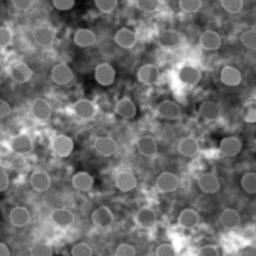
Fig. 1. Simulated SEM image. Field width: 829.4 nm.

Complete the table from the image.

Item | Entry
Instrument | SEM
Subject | a regular array of raised bodies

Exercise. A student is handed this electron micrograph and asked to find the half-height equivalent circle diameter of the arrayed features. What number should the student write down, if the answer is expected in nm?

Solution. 64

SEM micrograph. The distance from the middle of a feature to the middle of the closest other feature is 133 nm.